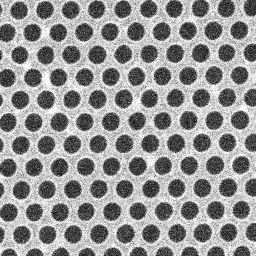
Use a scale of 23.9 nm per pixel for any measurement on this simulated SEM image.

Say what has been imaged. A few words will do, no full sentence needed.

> a regular array of holes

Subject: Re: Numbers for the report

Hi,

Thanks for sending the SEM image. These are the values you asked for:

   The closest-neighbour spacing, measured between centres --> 612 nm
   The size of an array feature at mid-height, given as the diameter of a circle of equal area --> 456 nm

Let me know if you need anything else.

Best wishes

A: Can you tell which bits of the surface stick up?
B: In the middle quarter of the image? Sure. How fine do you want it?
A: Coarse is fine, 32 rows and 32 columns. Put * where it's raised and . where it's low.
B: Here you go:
********************************
****...***...****...***...***...
.**....**.....**....**.....**...
.**.....*.....**....**.....**...
.**....***....**....***...***...
****..*****.*****..*****.*******
*..*****.*****..*****..****..***
....**....***....**....***....**
....**.....*.....**.....**....**
....**.....**....**.....**....**
....***...***...****...***...***
********************************
****...***...****...***...***...
.**....***....**.....*.....**...
.**....**.....**.....*.....**...
.**....***....**....***....**...
****...***...****..*****.*****..
***************.*****.******.***
*...***....**....***....**....**
....**.....**.....*.....**....**
....**.....**....**.....**....**
....**....***....***...***....**
*..*****************************
*****.*****..****...****..****..
.***....**....**.....**....**...
.**.....*.....**.....*.....**...
.**.....**....**.....**....**...
.***...***...****...***...****..
********************************
*...***...****...***...***....**
....***....**....***....**....**
....**.....**....**.....**....**